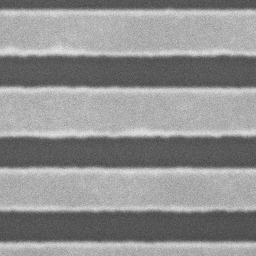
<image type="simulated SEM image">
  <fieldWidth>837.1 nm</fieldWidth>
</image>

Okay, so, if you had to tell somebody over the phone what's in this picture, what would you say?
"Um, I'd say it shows lines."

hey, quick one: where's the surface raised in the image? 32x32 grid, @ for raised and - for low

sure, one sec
--------------------------------
@@@@@@@@@@@@@@@@@@@@@@@@@@@@@@@@
@@@@@@@@@@@@@@@@@@@@@@@@@@@@@@@@
@@@@@@@@@@@@@@@@@@@@@@@@@@@@@@@@
@@@@@@@@@@@@@@@@@@@@@@@@@@@@@@@@
@@@@@@@@@@@@@@@@@@@@@@@@@@@@@@@@
@@@@@@@@@@@@@@@@@@@@@@@@@@@@@@@@
--------------------------------
--------------------------------
--------------------------------
--------------------------------
@@@@@@@@@@@@@@@@@@@@@@@@@@@@@@@@
@@@@@@@@@@@@@@@@@@@@@@@@@@@@@@@@
@@@@@@@@@@@@@@@@@@@@@@@@@@@@@@@@
@@@@@@@@@@@@@@@@@@@@@@@@@@@@@@@@
@@@@@@@@@@@@@@@@@@@@@@@@@@@@@@@@
@@@@@@@@@@@@@@@@@@@@@@@@@@@@@@@@
--------------------------------
--------------------------------
--------------------------------
--------------------------------
@@@@@@@@@@@@@@@@@@@@@@@@@@@@@@@@
@@@@@@@@@@@@@@@@@@@@@@@@@@@@@@@@
@@@@@@@@@@@@@@@@@@@@@@@@@@@@@@@@
@@@@@@@@@@@@@@@@@@@@@@@@@@@@@@@@
@@@@@@@@@@@@@@@@@@@@@@@@@@@@@@@@
--------------------------------
--------------------------------
--------------------------------
--------------------------------
@@@@@@@@@@@@@@@@@@@@@@@@@@@@@@@@
@@@@@@@@@@@@@@@@@@@@@@@@@@@@@@@@